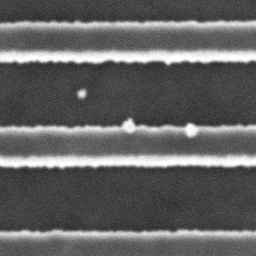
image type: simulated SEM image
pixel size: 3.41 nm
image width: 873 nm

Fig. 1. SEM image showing lines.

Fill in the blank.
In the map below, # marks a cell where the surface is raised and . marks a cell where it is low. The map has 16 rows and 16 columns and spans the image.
................
################
################
################
................
................
................
................
################
################
................
................
................
................
.#.##....#.###.#
################